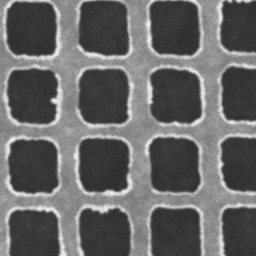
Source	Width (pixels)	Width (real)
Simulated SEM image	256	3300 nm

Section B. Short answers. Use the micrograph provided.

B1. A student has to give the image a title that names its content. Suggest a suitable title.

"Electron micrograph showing holes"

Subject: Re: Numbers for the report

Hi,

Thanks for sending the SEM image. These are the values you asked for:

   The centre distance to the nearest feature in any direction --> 0.884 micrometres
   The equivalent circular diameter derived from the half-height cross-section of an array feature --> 740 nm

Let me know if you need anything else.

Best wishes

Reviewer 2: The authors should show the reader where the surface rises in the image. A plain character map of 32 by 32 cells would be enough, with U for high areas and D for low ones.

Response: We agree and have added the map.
UUDDDDUUUUDDDDDUUUUDDDDDUUUUDDDD
UDDDDDDUUUDDDDDDUUUDDDDDDUUUDDDD
UDDDDDDUUUDDDDDDUUUDDDDDDUUUDDDD
UDDDDDDUUUDDDDDDUUUDDDDDDUUDDDDD
UDDDDDDUUUDDDDDDUUUDDDDDDUUDDDDD
UDDDDDDUUUDDDDDDUUUDDDDDDUUUDDDD
UDDDDDDUUUUDDDDDUUUDDDDDDUUUUUDD
UUUUUUUUUUUUUUUUUUUUUUUUUUUUUUUU
UUUUUUUUUUUUUUUUUUUUUUUUUUUUUDUU
UDDDDDDUUUDDDDDDUUUDDDDDDUUUDDDD
UDDDDDDUUUDDDDDDUUUDDDDDDUUUDDDD
UDDDDDDUUUDDDDDDUUUDDDDDDUUUDDDD
UDDDDDDUUUDDDDDDUUUDDDDDDUUUDDDD
UDDDDDDUUUDDDDDDUUUDDDDDDUUUDDDD
UDDDDDDUUUDDDDDDUUUDDDDDDUUUDDDD
UUUDDDUUUUUDDDDUUUUUUUUDUUUUUUUU
UUUUUUUUUUUUUUUUUUUUUUUUUUUUUUUU
UUDDDDUUUUDDDDDUUUUDDDDDUUUUDDDD
UDDDDDDUUUDDDDDDUUUDDDDDDUUUDDDD
UDDDDDDUUUDDDDDDUUUDDDDDDUUUDDDD
UDDDDDDUUUDDDDDDUUUDDDDDDUUUDDDD
UDDDDDDUUUDDDDDDUUUDDDDDDUUUDDDD
UDDDDDDUUUDDDDDDUUUDDDDDDUUUDDDD
UDDDDDDUUUDDDDDDUUUDDDDDDUUUDDDD
UUUUUUUUUUUUUUUUUUUUUUUUUUUUUUUU
UUUUUUUUUUUUUUUUUUUUUUUUUUUUUUUU
UUDDDDDUUUDDDDDDUUUDDDDDDUUUDDDD
UDDDDDDUUUDDDDDDUUUDDDDDDUUUDDDD
UDDDDDDUUUDDDDDDUUUDDDDDDUUUDDDD
UDDDDDDUUUDDDDDDUUUDDDDDDUUUDDDD
UDDDDDDDUUDDDDDDUUUDDDDDDUUUDDDD
UDDDDDDDUUDDDDDDUUUDDDDDDUUUDDDD